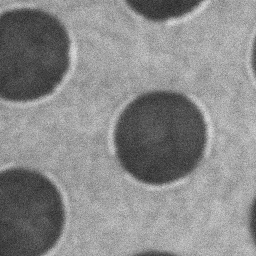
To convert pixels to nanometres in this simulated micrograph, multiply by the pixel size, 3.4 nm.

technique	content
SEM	holes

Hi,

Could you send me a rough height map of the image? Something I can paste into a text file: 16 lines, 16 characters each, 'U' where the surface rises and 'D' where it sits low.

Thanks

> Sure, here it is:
UUUUUUUUDDDDUUUU
DDDDUUUUUUUUUUUU
DDDDUUUUUUUUUUUU
DDDDUUUUUUUUUUUU
DDDDUUUUUUUUUUUU
DDDUUUUUUUUUUUUU
UUUUUUUUDDDDUUUU
UUUUUUUDDDDDDUUU
UUUUUUUDDDDDDUUU
UUUUUUUDDDDDDUUU
UDUUUUUUDDDDUUUU
DDDUUUUUUDDUUUUU
DDDDUUUUUUUUUUUU
DDDDUUUUUUUUUUUU
DDDDUUUUUUUUUUUU
DDDUUUUUUUUUUUUU